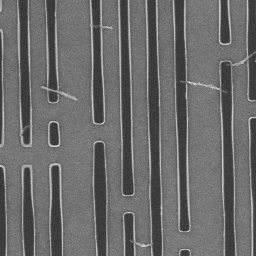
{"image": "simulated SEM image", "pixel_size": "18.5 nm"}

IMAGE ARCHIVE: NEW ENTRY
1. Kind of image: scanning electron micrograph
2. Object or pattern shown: groups of lines, slits or small figures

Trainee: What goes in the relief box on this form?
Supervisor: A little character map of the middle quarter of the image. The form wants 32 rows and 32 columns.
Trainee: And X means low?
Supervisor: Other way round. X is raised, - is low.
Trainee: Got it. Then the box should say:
-------XX-----XXX----XX-----XXX-
-------XX-----XXX----XXX----XXX-
-------XXX----XXX----XXX----XXX-
-------XXX----XXX----XXX----XXX-
-------XXX----XXX----XXX----XXX-
-------XXX----XXX----XXX----XXX-
-------XXX----XXX----XXX----XXX-
-------XXX----XXX----XXX----XXX-
-------XXX----XXX----XXX----XXX-
-------XXX----XXX----XXX----XXX-
-------XXX----XXX----XXX----XXX-
-------XXX----XXX----XXX----XXX-
-------XXX----XXX----XXX----XXX-
-------XXX----XXX----XXX----XXX-
-------XXX----XXX----XXX----XXX-
--------------XXX----XXX----XXX-
--------------XXX----XXX----XXX-
---------------XX----XXX----XXX-
---------------XX----XXX----XXX-
--------XX-----XX----XXX----XXX-
--------XX-----XX----XXX-----XX-
--------XX-----XX-----XX-----XX-
--------XX-----XX-----XX-----XX-
--------XX-----XX-----XX-----XX-
--------XX-----XX-----XX-----XX-
-------XXX-----XX-----XX-----XX-
-------XXX-----XX-----XX-----XX-
-------XXXX----XX-----XX-----XX-
-------XXXX----XX-----XX-----XX-
-------XXXX----XX-----XX-----XX-
-------XXXX----XX-----XX-----XX-
-------XXXX----XX-----XX-----XX-